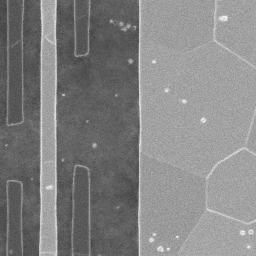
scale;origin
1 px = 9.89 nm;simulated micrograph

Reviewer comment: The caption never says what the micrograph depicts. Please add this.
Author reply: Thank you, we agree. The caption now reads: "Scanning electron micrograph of wiring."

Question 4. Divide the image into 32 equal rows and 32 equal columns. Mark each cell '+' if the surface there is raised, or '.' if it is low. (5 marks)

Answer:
.++..++..++......+++++++++++++++
.++..++..++......+++++++++++++++
.++..++..++......+++++++++++++++
.++..++..++......+++++++++++++++
.++..++..++......+++++++++++++++
.++..++..++......+++++++++++++++
.++..++..++......+++++++++++++++
.++..++..........+++++++++++++++
.++..++..........+++++++++++++++
.++..++..........+++++++++++++++
.++..++..........+++++++++++++++
.++..++..........+++++++++++++++
.++..++..........+++++++++++++++
.++..++..........+++++++++++++++
.++..++...........++++++++++++++
.+...++...........++++++++++++++
.....++...........++++++++++++++
.....++...........++++++++++++++
.....++..........+++++++++++++++
.....++..........+++++++++++++++
.....++..........+++++++++++++++
.....++..++......+++++++++++++++
.....++..++......+++++++++++++++
.++..++..++......+++++++++++++++
.++..++..++......+++++++++++++++
.++..++..++......+++++++++++++++
.++..++..++......+++++++++++++++
.++..++..++......+++++++++++++++
.++..++..++......+++++++++++++++
.++..++..++......+++++++++++++++
.++..++..++......+++++++++++++++
.++..++..++......+++++++++++++++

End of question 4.